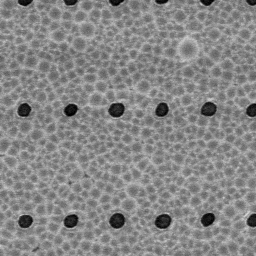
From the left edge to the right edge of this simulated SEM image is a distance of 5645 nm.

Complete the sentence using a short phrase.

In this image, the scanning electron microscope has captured a regular array of holes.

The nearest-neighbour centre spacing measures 0.621 micrometres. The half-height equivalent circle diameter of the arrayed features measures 0.333 micrometres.